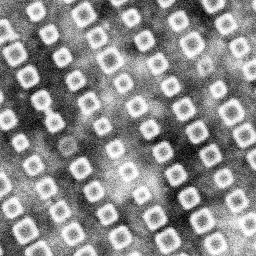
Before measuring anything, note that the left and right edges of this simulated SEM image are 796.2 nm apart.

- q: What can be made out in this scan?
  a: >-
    a regular array of raised bodies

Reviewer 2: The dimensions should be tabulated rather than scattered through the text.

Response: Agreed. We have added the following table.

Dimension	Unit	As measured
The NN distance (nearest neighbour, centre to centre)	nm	82.1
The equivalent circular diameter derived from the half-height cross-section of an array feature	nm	54.7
